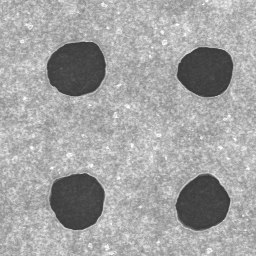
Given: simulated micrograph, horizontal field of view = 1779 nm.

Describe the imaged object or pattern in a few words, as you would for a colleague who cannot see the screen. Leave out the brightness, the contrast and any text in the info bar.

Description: holes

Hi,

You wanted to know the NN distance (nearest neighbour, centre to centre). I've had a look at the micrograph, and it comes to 886 nm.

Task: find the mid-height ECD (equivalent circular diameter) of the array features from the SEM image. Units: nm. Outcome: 381